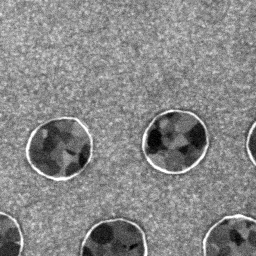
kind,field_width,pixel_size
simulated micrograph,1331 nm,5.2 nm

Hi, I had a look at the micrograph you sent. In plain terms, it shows raised bodies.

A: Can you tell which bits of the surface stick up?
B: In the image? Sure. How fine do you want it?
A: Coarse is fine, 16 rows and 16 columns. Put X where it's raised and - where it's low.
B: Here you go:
----------------
----------------
----------------
----------------
----------------
----------------
----------------
---XX-----XX----
--XXXX---XXXX---
--XXXX---XXXX---
--XXX-----XX----
----------------
----------------
X---------------
X-----XXX----XXX
X----XXXX----XXX